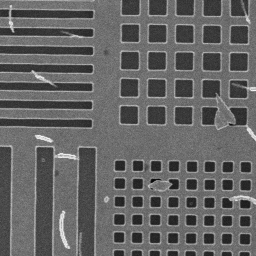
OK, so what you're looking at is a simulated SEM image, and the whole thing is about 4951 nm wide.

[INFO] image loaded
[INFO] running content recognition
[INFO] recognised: groups of lines, slits or small figures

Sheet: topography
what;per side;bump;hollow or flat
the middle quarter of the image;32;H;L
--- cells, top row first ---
LLLLLLLHHHHHHHLLLLLHHLLLLLHHLLLL
LLLLLLLHHHHHHHHHHHHHHHLLLHHHLLLL
HHHHHHHHHHHHHHHHHHHHHHHHHHHHHHHH
HHHHHHHHHHHHHHHLLHHHHHHHHHHHHHHH
HHHHHHHHHHHHHHLLLLLHHLLLLLHHLLLL
LLLLLLLHHHHHHHLLLLLHHLLLLLHHLLLL
LLLLLLLHHHHHHHLLLLLHHLLLLLHHLLLL
HHHHHHHHHHHHHHLLLLLHHLLLLLHHLLLL
HHHHHHHHHHHHHHHHHHHHHHHHHHHHHHHH
LLLLLLLHHHHHHHHHHHHHHHHHHHHHHHHH
LLLLLLLHHHHHHHLLLLHHHLLLLHHHHHHH
HHHHHHHHHHHHHHLLLLLHHLLLLLHHLLLL
HHHHHHHHHHHHHHLLLLLHHLLLLLHHLLLL
HHHHHHHHHHHHHHLLLLLHHLLLLLHHLLLL
LLLLLLLHHHHHHHLLLLLHHLLLLHHHLLLL
LLLLLLLHHHHHHHHHHHHHHHHHHHHHHHHH
HHHHHHHHHHHHHHHHHHHHHHHHHHHHHHHH
HHHHHHHHHHHHHHHHHHHHHHHHHHHHHHHH
HHHHHHHHHHHHHHHHHHHHHHHHHHHHHHHH
HHHHHHHHHHHHHHHHHHHHHHHHHHHHHHHH
HHHHHHHHHHHHHHHHHHHHHHHHHHHHHHHH
HHHHLLLLHHHHHHHHHHHHHHHHHHHHHHHH
HHHHLLLLHHHHHHHHHHHHHHHHHHHHHHHH
HHHHLLLLHHHHHHHHHHHHHHHHHHHHHHHH
HHHHLLLLHHHHHLLHHLLLHHLLHHLLLHHL
HHHHLLLLHHHHHLLHHLLLHHLLHHLLLHHL
HHHHLLLLHHHHHLLHHLLLHHLLHHLLLHHL
HHHHLLLLHHHHHHHHHHHHHHHHHHHHHHHH
HHHHLLLLHHHHHLLHHHLHHHLHHHHHHHHH
HHHHLLLLHHHHHLLHHLLLHHHHHHLLLHHL
HHHLLLLLHHHHHLLHHLLLHHHHHHHLLHHL
HHHLLLLLHHHHHHHHHHHHHHHHHHHHHHHL